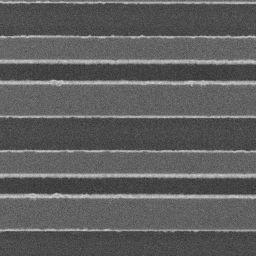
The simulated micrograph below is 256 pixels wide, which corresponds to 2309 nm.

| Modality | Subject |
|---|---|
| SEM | lines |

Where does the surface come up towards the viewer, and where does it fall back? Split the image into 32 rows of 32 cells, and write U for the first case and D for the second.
DDDDDDDDDDDDDDDDDDDDDDDDDDDDDDDD
DDDDDDDDDDDDDDDDDDDDDDDDDDDDDDDD
DDDDDDDDDDDDDDDDDDDDDDDDDDDDDDDD
DDDDDDDDDDDDDDDDDDDDDDDDDDDDDDDD
DDDDDDDDDDDDDDDDDUDDDDDDDDDDDDDD
UUUUUUUUUUUUUUUUUUUUUUUUUUUUUUUU
UUUUUUUUUUUUUUUUUUUUUUUUUUUUUUUU
UUUUUUUUUUUUUUUUUUUUUUUUUUUUUUUU
DDDDDDDDDDDDDDDDDDDDDDDDDDDDDDDD
DDDDDDDDDDDDDDDDDDDDDDDDDDDDDDDD
UUUUUUUUUUUUUUUUUUUUUUUUUUUUUUUU
UUUUUUUUUUUUUUUUUUUUUUUUUUUUUUUU
UUUUUUUUUUUUUUUUUUUUUUUUUUUUUUUU
UUUUUUUUUUUUUUUUUUUUUUUUUUUUUUUU
UUUUUUUUUUUUUUUUUUUUUUUUUUUUUUUU
DDDDDDDDDDDDDDDDDDDDDDDDDDDDDDDD
DDDDDDDDDDDDDDDDDDDDDDDDDDDDDDDD
DDDDDDDDDDDDDDDDDDDDDDDDDDDDDDDD
DDDDDDDDDDDDDDDDDDDDDDDDDDDDDDDD
UUUUUUUUUUUUUUUUUUUUUUUUUUUUUUUU
UUUUUUUUUUUUUUUUUUUUUUUUUUUUUUUU
UUUUUUUUUUUUUUUUUUUUUUUUUUUUUUUU
DDDDDDDDDDDDDDDDDDDDDDDDDDDDDDDD
DDDDDDDDDDDDDDDDDDDDDDDDDDDDDDDD
DDDUUDUUUDUUDDUUDDDDDDDDDDDDDDDD
UUUUUUUUUUUUUUUUUUUUUUUUUUUUUUUU
UUUUUUUUUUUUUUUUUUUUUUUUUUUUUUUU
UUUUUUUUUUUUUUUUUUUUUUUUUUUUUUUU
UUUUUUUUUUUUUUUUUUUUUUUUUUUUUUUU
DDDDDDDDDDDDDDDDDDDDDDDDDDDDDDDD
DDDDDDDDDDDDDDDDDDDDDDDDDDDDDDDD
DDDDDDDDDDDDDDDDDDDDDDDDDDDDDDDD